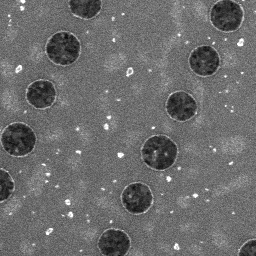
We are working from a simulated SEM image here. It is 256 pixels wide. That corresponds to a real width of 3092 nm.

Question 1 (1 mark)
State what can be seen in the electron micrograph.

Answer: raised bodies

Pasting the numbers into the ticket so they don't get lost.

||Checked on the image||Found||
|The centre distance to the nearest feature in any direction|0.614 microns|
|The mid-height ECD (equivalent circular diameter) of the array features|383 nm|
